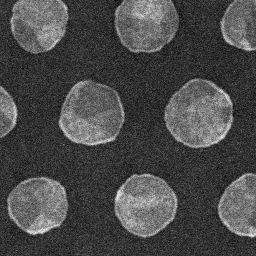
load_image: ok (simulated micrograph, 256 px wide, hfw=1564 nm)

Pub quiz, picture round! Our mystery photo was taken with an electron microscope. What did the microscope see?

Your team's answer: raised bodies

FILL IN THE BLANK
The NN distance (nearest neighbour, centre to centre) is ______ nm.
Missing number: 644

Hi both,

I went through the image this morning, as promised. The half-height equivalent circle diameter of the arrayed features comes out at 378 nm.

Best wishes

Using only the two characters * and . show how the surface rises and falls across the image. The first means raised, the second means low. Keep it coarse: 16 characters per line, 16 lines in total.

.***...****...**
.***...****...**
.***....***...**
................
................
.....**....***..
*...****...***..
*...****..****..
....***....***..
................
................
.***....**....**
.***...****...**
.***...****...**
........**.....*
................